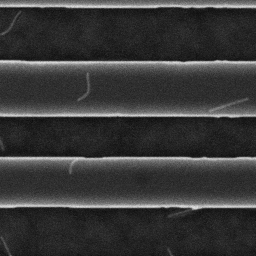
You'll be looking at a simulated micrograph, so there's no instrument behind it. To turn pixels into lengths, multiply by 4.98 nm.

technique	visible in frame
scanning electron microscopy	lines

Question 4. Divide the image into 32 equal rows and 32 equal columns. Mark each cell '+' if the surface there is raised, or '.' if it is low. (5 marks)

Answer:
++++++++++++++++++++++++++++++++
................................
................................
................................
................................
................................
................................
................................
++++++++++++++++++++++++++++++++
++++++++++++++++++++++++++++++++
++++++++++++++++++++++++++++++++
++++++++++++++++++++++++++++++++
++++++++++++++++++++++++++++++++
++++++++++++++++++++++++++++++++
++++++++++++++++++++++++++++++++
................................
................................
................................
................................
................................
++++++++++++++++++++++++++++++++
++++++++++++++++++++++++++++++++
++++++++++++++++++++++++++++++++
++++++++++++++++++++++++++++++++
++++++++++++++++++++++++++++++++
++++++++++++++++++++++++++++++++
................................
................................
................................
................................
................................
................................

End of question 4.